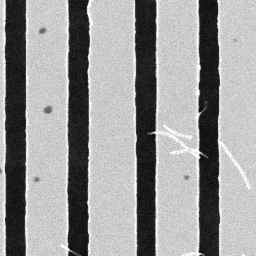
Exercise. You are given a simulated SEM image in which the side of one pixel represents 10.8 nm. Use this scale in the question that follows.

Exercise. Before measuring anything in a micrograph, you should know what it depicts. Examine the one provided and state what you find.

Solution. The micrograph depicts lines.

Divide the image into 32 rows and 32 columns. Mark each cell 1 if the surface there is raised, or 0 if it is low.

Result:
10011111000111111000111110011111
10011111000111111000111110011111
10011111100111111000111110011111
10011111000111111000111110011111
10011111000111111000111110011111
10011111000111111000111110011111
10011111100111111000111110011111
10011111000111111000111110011111
10011111000111111000111110011111
10011111000111111000111110011111
10011111100111111000111110011111
10011111000111111000111110011111
10011111000111111000111110011111
10011111000111111000111110011111
10011111000111111000111110011111
10011111000111111001111110011111
10011111000111111001111110011111
10011111000111111001111110011111
10011111000111111000111110011111
10011111000111111000111110011111
10011111000111111001111110011111
10011111000111111001111110011111
10011111000111111001111110011111
10011111000111111001111110011111
10011111000111111001111110011111
10011111000111111001111110011111
10011111000111111001111110011111
10011111000111111001111110011111
10011111000111111001111110011111
10011111000111111001111110011111
10011111000111111001111110011111
10011111100111111001111110011111